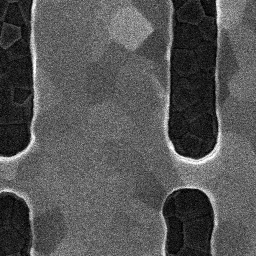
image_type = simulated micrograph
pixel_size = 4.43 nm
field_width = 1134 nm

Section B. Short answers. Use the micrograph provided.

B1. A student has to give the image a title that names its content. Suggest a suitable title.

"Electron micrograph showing holes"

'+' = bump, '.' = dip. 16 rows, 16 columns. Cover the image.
..+++++++++...++
..+++++++++...++
..+++++++++...++
..+++++++++...++
..+++++++++..+++
..+++++++++..+++
..+++++++++...++
..++++++++....++
..++++++++....++
.++++++++++..+++
++++++++++++++++
++++++++++++++++
.+++++++++...+++
..++++++++...+++
..++++++++...+++
..++++++++...+++